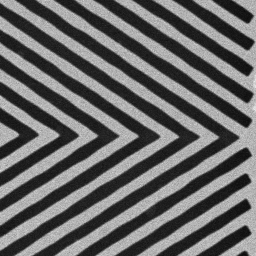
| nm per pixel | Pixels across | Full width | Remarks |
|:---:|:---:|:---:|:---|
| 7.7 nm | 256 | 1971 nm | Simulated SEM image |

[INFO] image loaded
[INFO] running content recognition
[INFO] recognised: groups of lines, slits or small figures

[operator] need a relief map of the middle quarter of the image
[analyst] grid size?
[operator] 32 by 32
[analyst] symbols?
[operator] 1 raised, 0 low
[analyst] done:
11000000111100000111110000001110
11110000011111000001111000000111
01111000000111100000111110000001
00111110000011111000001111000000
00001111000000111100000011110000
00000011110000011111000001111000
10000001111000000111100000111110
11100000011110000011111000001111
11110000001111000000111100000011
00111100000111110000011111000001
00011110000001111000000111100000
00001111100000111110000011110000
00000011110000001111000000111100
11000000111100000111110000011111
11110000011110000001111000000111
01111000001111100000111110000011
00111100000011110000001111000001
00001111000001111100000011110000
00011111000000111100000011110000
00111100000011111000000111100000
11110000001111100000011110000001
11100000011110000001111100000111
11000001111100000111110000001111
00000011110000001111000000111110
00001111100000111110000001111000
00111110000001111000000111110000
01111000000111110000011111000000
11110000001111000000111100000011
11000000111100000011111000001111
10000001111000000111100000011110
00000111100000011111000001111100
00011110000001111100000011110000